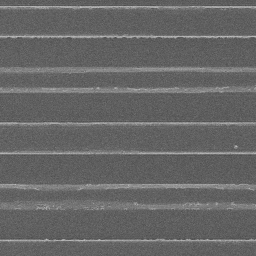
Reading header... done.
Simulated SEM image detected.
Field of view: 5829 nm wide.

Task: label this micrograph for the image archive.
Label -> lines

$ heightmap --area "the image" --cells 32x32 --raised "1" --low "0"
00000000000000000000000000000000
11111111111111111111111111111111
11111111111111111111111111111111
11111111111111111111111111111111
11111111111111111111111111111111
00000000000000000000000000000000
00000000000000000000000000000000
00000000000000000000000000000000
00000000000000000000000000000000
11111111111111111111111111111111
11111111111111111111111111111111
00000000000000000000000000000000
00000000000000000000000000000000
00000000000000000000000000000000
00000000000000000000000000000000
11111111110111111111111111111111
11111111111111111111111111111111
11111111111111111111111111111111
11111111111111111111111111111111
00000000000000000000000000000000
00000000000000000000000000000000
00000000000000000000000000000000
00000000000000000000000000000000
11111111111111111111111111111111
11111111111111111111111111111111
11111111111111111111111111111111
00000000000000000000000000000000
00000000000000000000000000000000
00000000000000000000000000000000
00000000000000000000000000000000
11111111111111111111111111111111
11111111111111111111111111111111